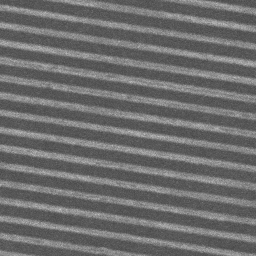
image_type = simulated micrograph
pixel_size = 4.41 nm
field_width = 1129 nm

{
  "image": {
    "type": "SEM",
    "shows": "parallel lines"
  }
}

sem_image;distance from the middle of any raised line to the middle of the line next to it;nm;76.6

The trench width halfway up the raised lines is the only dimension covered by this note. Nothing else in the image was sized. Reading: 0.0524 µm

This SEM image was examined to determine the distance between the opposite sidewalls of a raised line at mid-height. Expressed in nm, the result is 24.